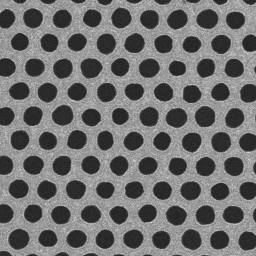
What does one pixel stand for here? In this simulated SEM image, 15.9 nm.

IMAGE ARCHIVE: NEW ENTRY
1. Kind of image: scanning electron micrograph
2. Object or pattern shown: a regular array of holes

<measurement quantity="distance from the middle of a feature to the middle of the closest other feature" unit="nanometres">439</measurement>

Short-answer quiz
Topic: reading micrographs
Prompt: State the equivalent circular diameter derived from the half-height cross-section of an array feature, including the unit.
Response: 297 nm